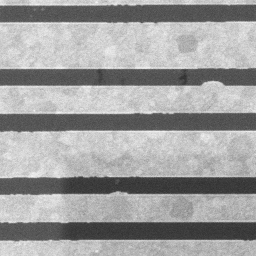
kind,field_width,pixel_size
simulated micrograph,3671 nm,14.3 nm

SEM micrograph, lines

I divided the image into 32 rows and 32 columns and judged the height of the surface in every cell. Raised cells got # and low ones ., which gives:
#############...#...............
................................
................................
################################
################################
################################
################################
################################
................................
................................
..........................##....
################################
################################
################################
................................
................................
................................
################################
################################
################################
################################
################################
................................
................................
################################
################################
################################
################################
................................
................................
################################
################################